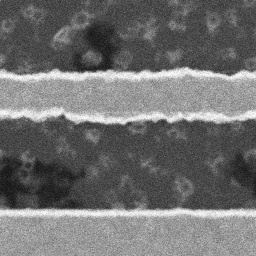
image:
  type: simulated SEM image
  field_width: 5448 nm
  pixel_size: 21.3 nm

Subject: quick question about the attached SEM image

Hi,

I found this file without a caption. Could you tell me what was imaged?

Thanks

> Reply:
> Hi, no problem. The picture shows one or a few lines or trenches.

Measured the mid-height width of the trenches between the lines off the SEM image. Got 2050 nm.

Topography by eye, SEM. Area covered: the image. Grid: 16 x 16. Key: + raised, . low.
................
................
................
................
................
++++++++++++++++
++++++++++++++++
......++........
................
................
................
................
................
++++++++++++++++
++++++++++++++++
++++++++++++++++